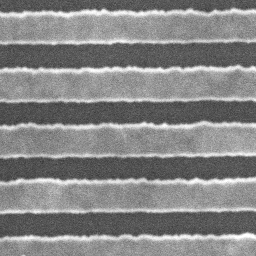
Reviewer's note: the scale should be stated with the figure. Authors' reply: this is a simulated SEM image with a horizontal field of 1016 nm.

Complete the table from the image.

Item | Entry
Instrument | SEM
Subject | lines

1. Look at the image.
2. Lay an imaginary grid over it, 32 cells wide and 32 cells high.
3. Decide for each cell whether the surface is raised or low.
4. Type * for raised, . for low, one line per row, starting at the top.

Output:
................................
.....**...******..*******.******
********************************
********************************
********************************
*...*.*..*...*..................
................................
................................
..............*.*.......***.****
********************************
********************************
********************************
*************************..*****
................................
................................
...*.........*...**.....********
********************************
********************************
********************************
**********************.***......
................................
................................
..*****..**..*****.*..*.*.*.****
********************************
********************************
********************************
***********.....................
................................
................................
...*....*...**.****.************
********************************
********************************